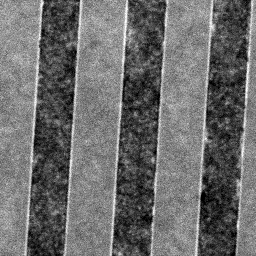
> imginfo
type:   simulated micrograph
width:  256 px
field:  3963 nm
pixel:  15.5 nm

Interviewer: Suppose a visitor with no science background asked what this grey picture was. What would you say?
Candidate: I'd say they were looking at one or a few lines or trenches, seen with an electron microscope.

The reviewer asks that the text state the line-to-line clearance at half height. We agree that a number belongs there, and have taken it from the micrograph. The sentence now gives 612 nm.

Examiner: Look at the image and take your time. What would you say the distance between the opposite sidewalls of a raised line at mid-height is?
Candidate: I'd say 703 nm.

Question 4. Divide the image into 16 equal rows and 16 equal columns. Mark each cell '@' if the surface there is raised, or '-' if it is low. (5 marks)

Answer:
@@@--@@@--@@@---
@@@--@@@--@@@---
@@---@@@--@@@---
@@---@@@--@@@---
@@---@@@--@@@--@
@@---@@@--@@@--@
@@---@@@--@@@--@
@@---@@---@@@--@
@@---@@---@@@--@
@@--@@@---@@@--@
@@--@@@---@@@--@
@@--@@@---@@@--@
@@--@@@---@@---@
@@--@@@---@@---@
@@--@@@---@@---@
@@--@@@--@@@---@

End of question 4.